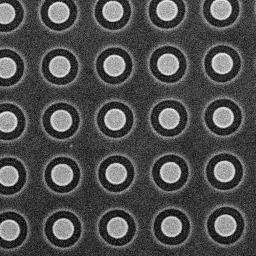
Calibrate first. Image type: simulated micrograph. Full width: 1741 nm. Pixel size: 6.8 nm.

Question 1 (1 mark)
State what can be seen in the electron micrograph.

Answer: an array of small figures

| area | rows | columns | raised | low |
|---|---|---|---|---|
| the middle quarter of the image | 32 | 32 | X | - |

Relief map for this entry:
X---XXXX--XXXXX--XXXX--XXXXXX--X
X---XXXX--XXXXX--XXXXX--XXXX--XX
X--XXXXXX--XXX---XXXXX---XX---XX
---XXXXXX-------XXXXXXX------XXX
--XXXXXXXX-----XXXXXXXXXX---XXXX
XXXXXXXXXXXXXXXXXXXXXXXXXXXXXXXX
XXXXXXXXXXXXXXXXXXXXXXXXXXXXXXXX
XXXXXXXXXXXXXXXXXXXXXXXXXXXXXXXX
XXXXXXXXXXXXXXXXXXXXXXXXXXXXXXXX
XXXXXXXXXXXX--XXXXXXXXXX-----XXX
--XXXXXXXX------XXXXXXX-------XX
---XXXXXX---XX---XXXXX---XX---XX
X---XXXX---XXXX--XXXXX--XXXXX--X
XX--XXXX--XXXXX--XXXXX--XXXXX--X
XX--XXXX--XXXXX--XXXXX--XXXXX--X
XX--XXXXX--XXXX--XXXXX---XXX--XX
---XXXXXX--------XXXXXX-------XX
---XXXXXXX------XXXXXXXX-----XXX
-XXXXXXXXXXX--XXXXXXXXXXXXXXXXXX
XXXXXXXXXXXXXXXXXXXXXXXXXXXXXXXX
XXXXXXXXXXXXXXXXXXXXXXXXXXXXXXXX
XXXXXXXXXXXXXXXXXXXXXXXXXXXXXXXX
XXXXXXXXXXXXXXXXXXXXXXXXXXXXXXXX
-XXXXXXXXXX-----XXXXXXXX-----XXX
---XXXXXXX-------XXXXXX-------XX
X---XXXXX--XXXX--XXXXX---XXX---X
XX--XXXXX--XXXX---XXXX--XXXXX--X
XX--XXXXX--XXXXX--XXXX--XXXXX--X
XX--XXXXX--XXXX--XXXXX---XXXX--X
X---XXXXX---XXX--XXXXXX---XX---X
---XXXXXXX------XXXXXXX-------XX
--XXXXXXXXX----XXXXXXXXXX---XXXX